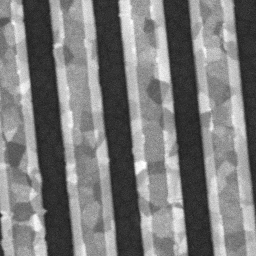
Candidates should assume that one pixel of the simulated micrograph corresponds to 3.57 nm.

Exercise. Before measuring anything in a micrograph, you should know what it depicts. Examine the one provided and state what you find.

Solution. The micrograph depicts one or a few lines or trenches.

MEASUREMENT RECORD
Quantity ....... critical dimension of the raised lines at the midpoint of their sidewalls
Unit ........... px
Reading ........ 31.3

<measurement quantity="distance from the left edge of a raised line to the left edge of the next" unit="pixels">69.6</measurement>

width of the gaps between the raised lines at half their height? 137 nm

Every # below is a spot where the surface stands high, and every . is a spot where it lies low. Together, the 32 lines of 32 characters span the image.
##.....####.....####....####....
##.....####.....####....#####...
##.....####.....####.....####...
##.....####.....####.....####...
##.....####.....####.....####...
###....####.....####.....####...
###....####.....####.....####...
###.....###.....####.....####...
###.....###.....####.....####...
###.....####.....###.....####...
###.....####.....####....####...
###.....####.....####.....###...
###.....####.....####.....###...
###.....####.....####.....####..
###.....####.....####.....####..
####....####.....####.....####..
####....####.....####.....####..
####.....###.....####.....####..
####.....####....####.....####..
####.....####....####.....####..
####.....####.....####....####..
####.....####.....####....####..
####.....####.....####....#####.
####.....####.....####.....####.
.###.....####.....####.....####.
.####....####.....####.....####.
.####....####.....####.....####.
.####.....###.....####.....####.
.####.....####....####.....####.
.####.....####.....###.....####.
.####.....####.....####....####.
.####.....####.....####....####.